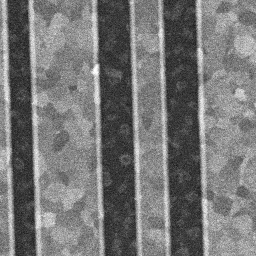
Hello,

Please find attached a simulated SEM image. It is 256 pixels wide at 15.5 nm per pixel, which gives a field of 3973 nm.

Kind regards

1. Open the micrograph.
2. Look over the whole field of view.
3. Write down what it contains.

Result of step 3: one or a few lines or trenches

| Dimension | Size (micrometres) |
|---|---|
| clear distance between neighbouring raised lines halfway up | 0.591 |